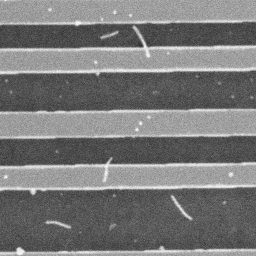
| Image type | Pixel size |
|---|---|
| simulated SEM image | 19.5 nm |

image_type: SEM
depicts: lines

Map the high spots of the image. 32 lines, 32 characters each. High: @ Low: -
@@@@@@@@@@@@@@@@@@@@@@@@@@@@@@@@
@@@@@@@@@@@@@@@@@@@@@@@@@@@@@@@@
@@@@@@@@@@@@@@@@@@@@@@@@@@@@@@@@
--------------------------------
--------------------------------
--------------------------------
@@@@@@@@@@@@@@@@@@@@@@@@@@@@@@@@
@@@@@@@@@@@@@@@@@@@@@@@@@@@@@@@@
@@@@@@@@@@@@@@@@@@@@@@@@@@@@@@@@
--------------------------------
--------------------------------
--------------------------------
--------------------------------
--------------------------------
@@@@@@@@@@@@@@@@@@@@@@@@@@@@@@@@
@@@@@@@@@@@@@@@@@@@@@@@@@@@@@@@@
@@@@@@@@@@@@@@@@@@@@@@@@@@@@@@@@
--------------------------------
--------------------------------
--------------------------------
-------------@----------------@@
@@@@@@@@@@@@@@@@@@@@@@@@@@@@@@@@
@@@@@@@@@@@@@@@@@@@@@@@@@@@@@@@@
@@@@@@@@@@@@@@@@@@@@@@----------
--------------------------------
--------------------------------
--------------------------------
--------------------------------
--------------------------------
--------------------------------
--------------------------------
--@----@@-@@@@@@@@@@@@@@@@@@@@@@